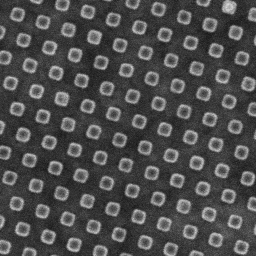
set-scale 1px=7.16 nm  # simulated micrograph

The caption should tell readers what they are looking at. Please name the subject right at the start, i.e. a regular array of raised bodies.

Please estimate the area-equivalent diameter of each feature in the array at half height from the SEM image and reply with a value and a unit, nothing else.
96.7 nm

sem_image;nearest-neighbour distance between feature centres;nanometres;187